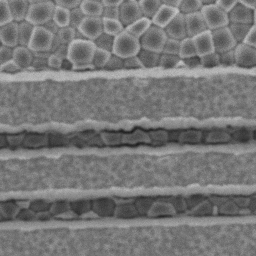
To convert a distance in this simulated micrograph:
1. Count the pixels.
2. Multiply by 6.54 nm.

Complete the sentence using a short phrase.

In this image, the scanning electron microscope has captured one or a few lines or trenches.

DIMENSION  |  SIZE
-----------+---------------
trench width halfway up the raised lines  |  175 nm